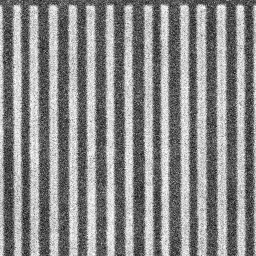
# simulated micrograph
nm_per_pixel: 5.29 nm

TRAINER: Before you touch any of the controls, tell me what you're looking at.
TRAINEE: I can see parallel lines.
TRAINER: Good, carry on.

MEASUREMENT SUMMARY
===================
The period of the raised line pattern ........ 0.0984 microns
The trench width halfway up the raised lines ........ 65.5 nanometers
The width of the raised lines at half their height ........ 35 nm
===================